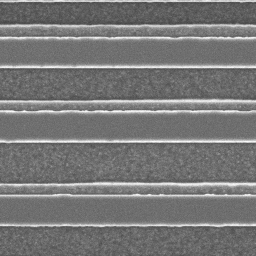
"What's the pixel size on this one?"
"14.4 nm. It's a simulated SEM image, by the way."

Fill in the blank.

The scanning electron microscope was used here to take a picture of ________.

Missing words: lines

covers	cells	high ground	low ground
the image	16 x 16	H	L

LLLLLLLLLLLLLLLL
LLLLLLLLLLLLLLLL
HHHHHHHHHHHHHHHH
HHHHHHHHHHHHHHHH
LLLLLLLLLLLLLLLL
LLLLLLLLLLLLLLLL
HHHHHHHHHHHHHHHH
HHHHHHHHHHHHHHHH
HHHHHHHHHHHHHHHH
LLLLLLLLLLLLLLLL
LLLLLLLLLLLLLLLL
LLLLLLLLLLLLLLLL
HHHHHHHHHHHHHHHH
HHHHHHHHHHHHHHHH
LLLLLLLLLLLLLLLL
LLLLLLLLLLLLLLLL